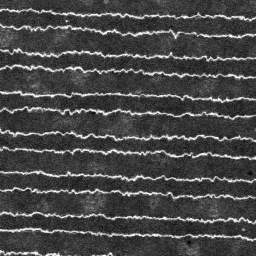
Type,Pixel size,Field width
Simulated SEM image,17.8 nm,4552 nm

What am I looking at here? parallel lines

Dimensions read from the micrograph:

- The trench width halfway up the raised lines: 409 nm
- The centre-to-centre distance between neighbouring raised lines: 720 nm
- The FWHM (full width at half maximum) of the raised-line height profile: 309 nanometers